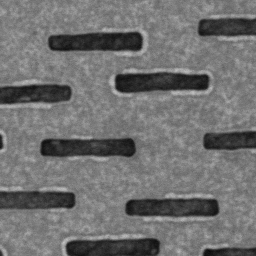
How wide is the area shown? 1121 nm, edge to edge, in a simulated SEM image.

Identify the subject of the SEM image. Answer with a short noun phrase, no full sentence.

holes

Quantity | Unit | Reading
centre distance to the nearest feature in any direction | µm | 0.378